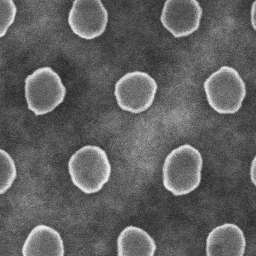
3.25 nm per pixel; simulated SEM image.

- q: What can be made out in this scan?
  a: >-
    raised bodies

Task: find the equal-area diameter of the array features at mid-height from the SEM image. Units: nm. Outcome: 133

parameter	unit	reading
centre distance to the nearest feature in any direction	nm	291